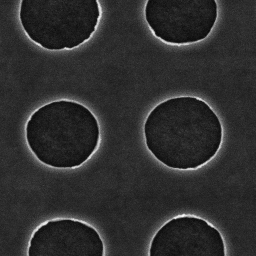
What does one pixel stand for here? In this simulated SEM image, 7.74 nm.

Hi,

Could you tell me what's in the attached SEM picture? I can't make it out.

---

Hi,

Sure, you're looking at holes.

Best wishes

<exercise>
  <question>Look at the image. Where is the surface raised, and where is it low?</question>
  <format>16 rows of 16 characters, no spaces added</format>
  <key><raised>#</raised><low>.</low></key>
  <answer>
#.....###.....##
#.....###....###
##...#####..####
################
################
################
###..#####...###
##....###.....##
##....###.....##
##....###....###
###########.####
################
################
################
##....####....##
##....###.....##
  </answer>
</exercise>